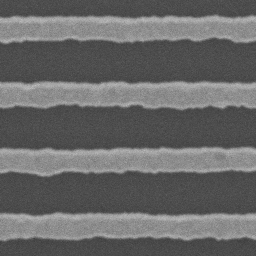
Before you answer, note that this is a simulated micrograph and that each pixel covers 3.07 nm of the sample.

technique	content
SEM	lines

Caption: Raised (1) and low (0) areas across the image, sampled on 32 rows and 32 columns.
00000000000000000000000000000000
00000000000000000000000000000000
11111111111111111111111111111111
11111111111111111111111111111111
11111111111111111111111111111111
00000000000000000000000000000000
00000000000000000000000000000000
00000000000000000000000000000000
00000000000000000000000000000000
00000000000000000000000000000000
11101111111111111111111111111111
11111111111111111111111111111111
11111111111111111111111111111111
00000000000000000010001000000000
00000000000000000000000000000000
00000000000000000000000000000000
00000000000000000000000000000000
00000000000000000000000000000000
00000000000000000000000001000010
11111111111111111111111111111111
11111111111111111111111111111111
10111111001111100011010011000000
00000000000000000000000000000000
00000000000000000000000000000000
00000000000000000000000000000000
00000000000000000000000000000000
00000000000000000000000000000000
11111111111111111111111111111111
11111111111111111111111111111111
11111111111101111111111111111111
00000000000000000000000000000000
00000000000000000000000000000000